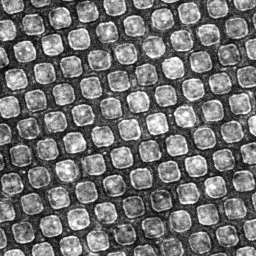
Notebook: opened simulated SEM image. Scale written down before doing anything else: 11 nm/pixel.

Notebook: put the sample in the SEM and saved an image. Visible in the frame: a regular array of raised bodies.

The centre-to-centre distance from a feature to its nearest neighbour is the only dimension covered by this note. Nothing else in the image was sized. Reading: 306 nanometres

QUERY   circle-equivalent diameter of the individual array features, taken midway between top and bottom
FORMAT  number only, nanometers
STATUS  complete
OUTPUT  230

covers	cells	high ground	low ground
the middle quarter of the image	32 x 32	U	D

UUUUDDDUUUUDDDDDDDDUUUDDDUUUUUDD
UUUUUDDDUDDDDDDDDDUUUUUDDUUUUUDD
UUUUDDDDDDDUUUUUDDUUUUUDDUUUUUDD
DDDDDDDUDDDUUUUUDUDUUUUDDDUUDDDD
DDDDUUUUUDDUUUUUDUDUUUUDDDDDDDUU
UUDDUUUUUDDDUUUUDDDDDDDDDDDDDDUU
UUDDUUUUUDDDUUUDDDDDDDDUUUUDDDUU
UUDDDUUUUDDDDDDDDUUUDDDUUUUUDDUU
UUUDDDDDDDDDDDDDUUUUUDDUUUUUDDDU
UUDDDDDDDDUUUUDDUUUUUDDUUUUUDDDD
DDDDUUDDDUUUUUDDUUUUUDDDDDDDDDDD
DDUUUUUDDUUUUUDUDUUUUDDDDDDDUUUU
DDUUUUUDDDUUUUDUDDDDDDDUUDDDUUUU
DDDUUUUDDDUUDDDDDDDDDUUUUDDDUUUU
DDDUUUUDDDDDDDUUUUDUDUUUUUDDUUUU
UDDDDDDDDDDDDDUUUUDDDUUUUUDDDUUD
DDDDDDDUUUUUDDUUUUUDDUUUUUDDDDDD
DUUUDDDUUUUUDDUUUUUDUDDDDDDDDDDD
UUUUUDDUUUUUDDDUUUDDUDDDDDUUUUDD
UUUUUDDDUUUUDDDDDDDDDUUDDDUUUUDD
UUUUUDDDDDDDDDDDDDDUUUUUDDUUUUUD
DUUUUDDDDDDDUUUUDDDUUUUUDDUUUUUD
DDDDDDDDDDDDUUUUUDDUUUUUDDDUUDDD
DDDDDUUUUUDDUUUUUDDUUUUUDDDDDDDD
UUDDDUUUUUDDUUUUUDDDDDDDDDUDDDUU
UUUDDUUUUUDDDUUUDDDDDDDDUUUUDDDU
UUUDDDUUUUDDDDDDDDUUUDDDUUUUUDDU
UUUDDDUUUDDDDDDDDUUUUUDDUUUUUDDU
UUUDDDDDDDDUUUDDDUUUUUDDUUUUUDDD
DDDDDDDDDDUUUUUDDUUUUUDDDUDDDDDD
DDDUUUUUDDUUUUUDDDUUUUDDDDDDDUUU
DDDUUUUUDDUUUUUDDDDDDDDDDDDDUUUU